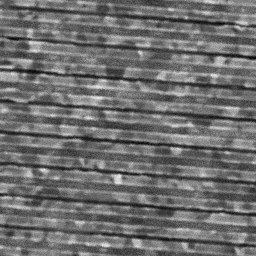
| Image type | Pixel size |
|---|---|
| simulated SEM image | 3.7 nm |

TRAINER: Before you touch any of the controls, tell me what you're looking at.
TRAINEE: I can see parallel lines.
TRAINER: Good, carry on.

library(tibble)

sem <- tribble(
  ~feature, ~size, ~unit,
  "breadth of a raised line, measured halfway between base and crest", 32.2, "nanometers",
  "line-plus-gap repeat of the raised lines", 57.4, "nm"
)